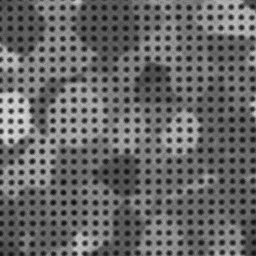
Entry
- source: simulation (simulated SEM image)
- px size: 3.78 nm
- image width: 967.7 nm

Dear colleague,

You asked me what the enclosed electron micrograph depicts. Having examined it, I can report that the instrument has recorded a regular array of holes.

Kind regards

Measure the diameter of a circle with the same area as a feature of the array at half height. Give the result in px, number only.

6.96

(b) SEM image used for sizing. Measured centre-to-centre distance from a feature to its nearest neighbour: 9.84 pixels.